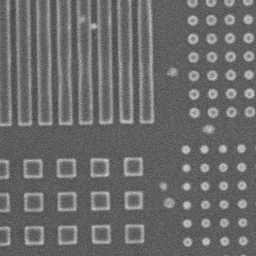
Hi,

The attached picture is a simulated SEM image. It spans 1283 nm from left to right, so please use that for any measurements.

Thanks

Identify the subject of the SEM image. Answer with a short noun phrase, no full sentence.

groups of lines, slits or small figures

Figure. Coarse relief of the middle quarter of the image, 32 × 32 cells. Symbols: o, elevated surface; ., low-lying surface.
o...ooo..ooo..ooo..ooo..........
o...ooo..ooo..ooo..ooo..........
o...ooo..ooo..ooo..ooo.........o
o...ooo..ooo..ooo..ooo..........
o...ooo..ooo..ooo..ooo..........
oo..ooo..ooo..ooo..ooo..........
oo..ooo..ooo..ooo..ooo..........
oo..ooo..ooo..ooo..ooo..........
oo..ooo..ooo..ooo..ooo..........
oo..ooo..ooo..ooo..ooo..........
oo..ooo..ooo..ooo..ooo..........
oo..ooo..ooo..ooo..ooo..........
oo..ooo..ooo..ooo..ooo..........
oo..ooo..ooo..ooo..ooo..........
oo..ooo..ooo..ooo..ooo..........
................................
................................
................................
................................
................................
................................
..............................o.
................................
................................
ooo....oooo....oooo.............
ooo....oooo....oooo...........o.
ooo....oooo....oooo...........o.
ooo....oooo.....ooo.............
................................
................................
..............................o.
................................